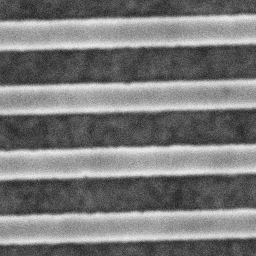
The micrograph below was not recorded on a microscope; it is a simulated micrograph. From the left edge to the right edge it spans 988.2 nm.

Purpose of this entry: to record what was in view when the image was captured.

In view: one or a few lines or trenches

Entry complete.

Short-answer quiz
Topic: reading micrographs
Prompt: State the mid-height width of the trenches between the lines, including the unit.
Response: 36.5 pixels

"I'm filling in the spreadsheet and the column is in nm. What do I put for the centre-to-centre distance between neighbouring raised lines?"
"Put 250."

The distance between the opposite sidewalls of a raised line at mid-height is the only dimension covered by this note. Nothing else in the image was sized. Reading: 108 nm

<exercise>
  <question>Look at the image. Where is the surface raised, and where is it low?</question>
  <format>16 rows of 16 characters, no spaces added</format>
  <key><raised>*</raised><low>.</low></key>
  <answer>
................
****************
****************
................
................
****************
****************
................
................
****************
****************
................
................
.***************
****************
................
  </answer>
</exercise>